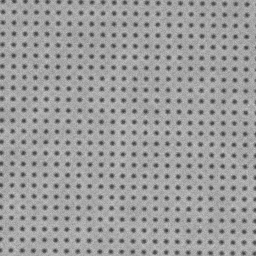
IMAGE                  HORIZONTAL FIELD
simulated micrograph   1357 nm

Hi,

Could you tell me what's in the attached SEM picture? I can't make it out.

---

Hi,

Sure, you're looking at a regular array of holes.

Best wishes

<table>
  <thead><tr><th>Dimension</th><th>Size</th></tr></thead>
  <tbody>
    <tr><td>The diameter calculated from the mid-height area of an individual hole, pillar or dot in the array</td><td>24.7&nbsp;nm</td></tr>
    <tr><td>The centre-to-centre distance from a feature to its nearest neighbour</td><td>56.9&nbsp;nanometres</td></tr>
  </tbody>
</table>